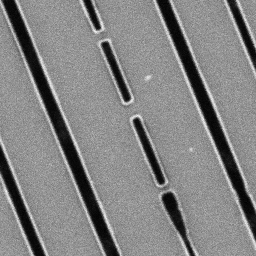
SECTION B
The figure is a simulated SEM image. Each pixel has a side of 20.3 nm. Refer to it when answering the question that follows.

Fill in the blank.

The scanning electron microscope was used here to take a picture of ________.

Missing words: one or a few lines or trenches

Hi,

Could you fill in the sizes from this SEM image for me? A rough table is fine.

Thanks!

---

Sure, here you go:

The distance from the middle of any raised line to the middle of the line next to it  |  1.44 um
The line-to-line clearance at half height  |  1150 nm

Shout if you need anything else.